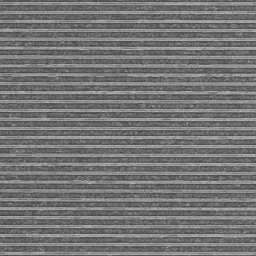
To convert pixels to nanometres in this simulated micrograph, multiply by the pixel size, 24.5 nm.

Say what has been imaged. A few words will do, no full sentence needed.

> parallel lines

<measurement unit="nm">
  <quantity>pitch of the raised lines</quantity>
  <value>219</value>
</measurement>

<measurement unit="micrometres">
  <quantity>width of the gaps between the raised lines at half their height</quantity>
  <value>0.16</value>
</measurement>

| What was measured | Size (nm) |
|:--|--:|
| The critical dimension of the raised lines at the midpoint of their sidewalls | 55.2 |